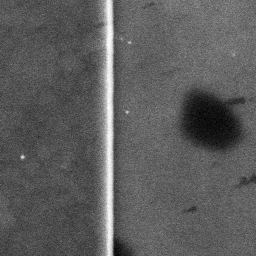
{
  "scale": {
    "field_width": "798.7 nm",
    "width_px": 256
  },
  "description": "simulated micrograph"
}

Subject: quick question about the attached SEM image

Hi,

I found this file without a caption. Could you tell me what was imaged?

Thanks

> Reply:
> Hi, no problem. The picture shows wiring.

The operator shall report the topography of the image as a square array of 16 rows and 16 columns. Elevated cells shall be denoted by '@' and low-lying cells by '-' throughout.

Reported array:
@@@@@@@---------
@@@@@@@---------
@@@@@@@---------
@@@@@@@---------
@@@@@@@---------
@@@@@@@---------
@@@@@@@---------
@@@@@@@---------
@@@@@@@---------
@@@@@@@---------
@@@@@@@---------
@@@@@@@---------
@@@@@@@---------
@@@@@@@---------
@@@@@@@---------
@@@@@@@---------